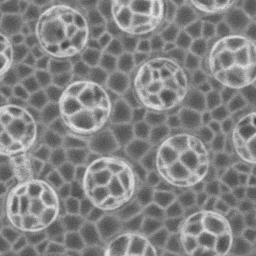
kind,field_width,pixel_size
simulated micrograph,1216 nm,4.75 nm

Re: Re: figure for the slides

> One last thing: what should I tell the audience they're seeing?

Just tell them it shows raised bodies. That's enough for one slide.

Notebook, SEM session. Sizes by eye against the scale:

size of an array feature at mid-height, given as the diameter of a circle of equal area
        241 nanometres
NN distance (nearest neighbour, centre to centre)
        375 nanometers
